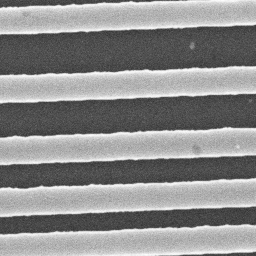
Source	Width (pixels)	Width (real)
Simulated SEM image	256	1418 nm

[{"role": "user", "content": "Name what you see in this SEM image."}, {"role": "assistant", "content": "lines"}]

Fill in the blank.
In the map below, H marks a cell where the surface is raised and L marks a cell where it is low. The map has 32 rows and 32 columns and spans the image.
LLLLLLLLLLLLHHHHHHHHHHHHHHHHHHHH
HHHHHHHHHHHHHHHHHHHHHHHHHHHHHHHH
HHHHHHHHHHHHHHHHHHHHHHHHHHHHHHHH
HHHHHHHHHHHHHHHHHHHHLLLLLLLLLLLL
LLLLLLLLLLLLLLLLLLLLLLLLLLLLLLLL
LLLLLLLLLLLLLLLLLLLLLLLLLLLLLLLL
LLLLLLLLLLLLLLLLLLLLLLLLLLLLLLLL
LLLLLLLLLLLLLLLLLLLLLLLLLLLLLLLL
LLLLLLLLLLLLLLLLLLLLLLLLLLLLHHHH
HHHHHHHHHHHHHHHHHHHHHHHHHHHHHHHH
HHHHHHHHHHHHHHHHHHHHHHHHHHHHHHHH
HHHHHHHHHHHHHHHHHHHHHHHHHHHHHHHH
HHHHHHHHLLLLLLLLLLLLLLLLLLLLLLLL
LLLLLLLLLLLLLLLLLLLLLLLLLLLLLLLL
LLLLLLLLLLLLLLLLLLLLLLLLLLLLLLLL
LLLLLLLLLLLLLLLLLLLLLLLLLLLLLLLL
LLLLLLLLLLLLLLLLLLHHHHHHHHHHHHHH
HHHHHHHHHHHHHHHHHHHHHHHHHHHHHHHH
HHHHHHHHHHHHHHHHHHHHHHHHHHHHHHHH
HHHHHHHHHHHHHHHHHHHHHHHHHHHHLLLL
HHLLLLLLLLLLLLLLLLLLLLLLLLLLLLLL
LLLLLLLLLLLLLLLLLLLLLLLLLLLLLLLL
LLLLLLLLLLLLLLLLLLLLLLLLLLLHLHHH
LLLLHHHHHHHHHHHHHHHHHHHHHHHHHHHH
HHHHHHHHHHHHHHHHHHHHHHHHHHHHHHHH
HHHHHHHHHHHHHHHHHHHHHHHHHHHHHHHH
HHHHHHHHHHHHHLLLLLLLLLLLLLLLLLLL
LLLLLLLLLLLLLLLLLLLLLLLLLLLLLLLL
LLLLLLLLLLLLLLLLLLLLHHHHHHHHHHHH
HHHHHHHHHHHHHHHHHHHHHHHHHHHHHHHH
HHHHHHHHHHHHHHHHHHHHHHHHHHHHHHHH
HHHHHHHHHHHHHHHHHHHHHHHHHHHHHLLL